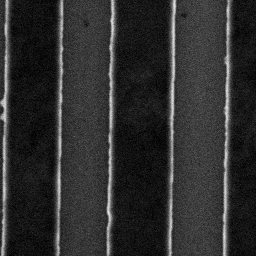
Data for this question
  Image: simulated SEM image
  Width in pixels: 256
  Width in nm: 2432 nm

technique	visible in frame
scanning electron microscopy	lines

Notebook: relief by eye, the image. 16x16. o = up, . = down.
oooo...oooo...oo
oooo...oooo...oo
oooo...oooo...oo
oooo...oooo...oo
oooo...oooo...oo
oooo...oooo...oo
oooo...oooo...oo
oooo...oooo...oo
oooo...oooo...oo
oooo...oooo...oo
oooo...oooo...oo
oooo...oooo...oo
oooo...oooo...oo
oooo...oooo...oo
oooo...oooo...oo
oooo...oooo...oo